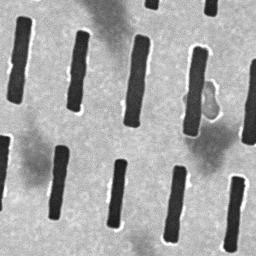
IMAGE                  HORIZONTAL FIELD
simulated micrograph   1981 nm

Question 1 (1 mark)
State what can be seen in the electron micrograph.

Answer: holes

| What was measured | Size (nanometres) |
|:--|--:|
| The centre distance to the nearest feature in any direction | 461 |